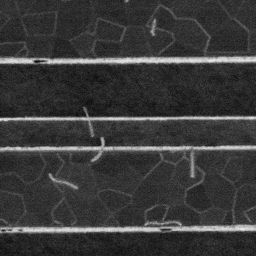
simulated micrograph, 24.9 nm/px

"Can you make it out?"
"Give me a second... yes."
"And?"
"lines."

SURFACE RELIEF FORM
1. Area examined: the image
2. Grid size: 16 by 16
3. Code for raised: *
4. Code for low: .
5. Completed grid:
****************
****************
****************
****************
................
................
................
................
................
****************
****************
****************
****************
****************
................
................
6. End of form